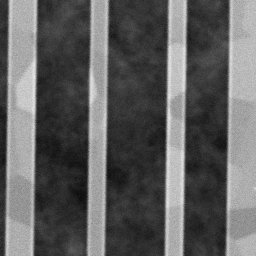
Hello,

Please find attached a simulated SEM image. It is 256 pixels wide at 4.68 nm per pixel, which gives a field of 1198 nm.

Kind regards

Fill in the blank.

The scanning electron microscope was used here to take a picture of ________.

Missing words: one or a few lines or trenches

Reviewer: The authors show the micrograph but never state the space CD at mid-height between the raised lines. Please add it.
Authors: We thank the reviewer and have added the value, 261 nm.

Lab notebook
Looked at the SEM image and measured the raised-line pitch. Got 362 nanometers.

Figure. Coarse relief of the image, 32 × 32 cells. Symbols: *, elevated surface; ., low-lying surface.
.***........*........**......***
.***........*........**......***
.***........*........**......***
.***........*........**......***
.***.......**........**......***
.***.......**........**......***
.***.......**........**......***
.***.......**........**......***
.***.......**........**......***
.***.......**........**......***
.***.......**........**......***
.***.......**........**......***
.***.......**........**......***
.***.......**........**......***
.***.......**........**......***
.***.......**........**......***
.***.......**........**......***
.***.......**........**......***
.***.......**........**......***
.***.......**........**......***
.***.......**........**......***
.***.......**........**......***
.***.......**........**......***
.***.......**........**......***
.***.......**........**......***
.***.......**........**......***
.***.......**........**......***
.***.......**........**......***
.***.......**........**......***
.***.......**........**.....****
.***.......**........**.....****
.***.......**........**.....****